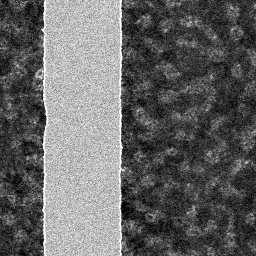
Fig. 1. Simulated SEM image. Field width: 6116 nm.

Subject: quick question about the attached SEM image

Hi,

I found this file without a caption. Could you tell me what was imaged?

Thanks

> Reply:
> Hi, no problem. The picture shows one or a few lines or trenches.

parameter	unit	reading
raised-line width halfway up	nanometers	1820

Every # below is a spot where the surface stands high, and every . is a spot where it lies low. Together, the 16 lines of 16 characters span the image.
...#####........
...#####........
...#####........
...#####........
...#####........
...####.........
...#####........
...#####........
...#####........
...#####........
...#####........
...####.........
...#####........
...#####........
...#####........
...#####........